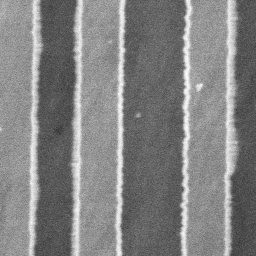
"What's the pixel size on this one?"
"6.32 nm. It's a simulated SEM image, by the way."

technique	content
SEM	lines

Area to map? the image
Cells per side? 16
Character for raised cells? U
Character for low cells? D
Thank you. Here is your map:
UUDDDUUUDDDDUUDD
UUDDDUUUDDDDUUDD
UUDDDUUUDDDDUUDD
UUDDDUUUDDDDUUDD
UUDDDUUUDDDDUUDD
UUDDDUUUDDDDUUDD
UUDDDUUDDDDDUUDD
UUDDDUUDDDDDUUDD
UUDDDUUUDDDDUUDD
UUDDDUUDDDDDUUDD
UUDDDUUDDDDDUUDD
UUDDDUUDDDDDUUDD
UUDDDUUDDDDDUUDD
UUDDDUUDDDDDUUDD
UUDDDUUDDDDDUUDD
UUDDDUUDDDDDUUDD